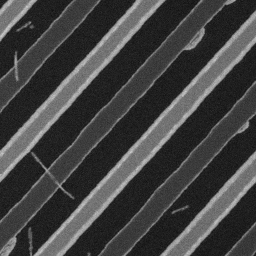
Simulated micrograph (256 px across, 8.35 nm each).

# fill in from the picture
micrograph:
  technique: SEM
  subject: lines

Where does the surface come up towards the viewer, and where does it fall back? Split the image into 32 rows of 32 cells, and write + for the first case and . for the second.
.+++.....+++.....+++.....+++....
+++.....+++.....+++.....+++.....
++.....+++.....+++.....+++.....+
+.....++++....+++.....+++.....++
.....++++....+++.....++++....+++
....++++....+++.....++++....++++
...++++....++++....++++....++++.
..++++....++++....++++.....+++..
..+++.....+++....++++.....+++...
.+++.....+++.....+++.....+++....
+++.....+++.....+++.....+++.....
++.....+++.....+++.....+++.....+
+.....+++.....+++.....+++.....++
+....+++.....+++.....+++.....+++
....+++.....+++.....++++....++++
...+++.....+++.....++++....++++.
..++++....++++....++++....++++..
.++++....++++....++++....++++...
.+++.....+++.....+++....++++....
+++....++++.....+++.....+++.....
++.....+++.....+++.....+++.....+
+.....+++.....+++.....+++.....++
.....+++.....+++.....+++.....+++
....+++.....+++.....+++.....+++.
...+++.....+++.....+++.....+++..
..++++....+++.....+++.....+++...
.++++....++++....++++....++++...
++++....++++....++++....++++....
+++....++++....++++....++++....+
++.....+++....++++....++++....++
+.....+++....++++.....+++....+++
+....+++.....+++.....+++.....+++